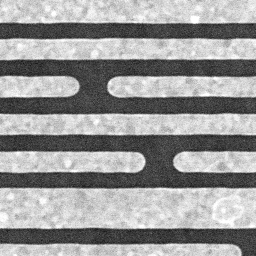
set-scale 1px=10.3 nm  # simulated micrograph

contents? groups of lines, slits or small figures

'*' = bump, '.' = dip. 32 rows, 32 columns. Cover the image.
********************************
********************************
********************************
................................
................................
********************************
********************************
................................
................................
................................
**********....******************
**********....******************
................................
................................
********************************
********************************
********************************
................................
................................
******************....**********
******************....**********
.***........**..*.........***.*.
................................
................................
********************************
********************************
********************************
********************************
................................
................................
................................
******************************..